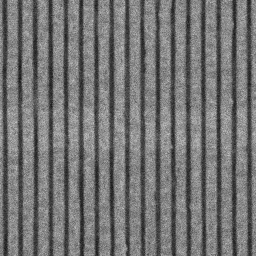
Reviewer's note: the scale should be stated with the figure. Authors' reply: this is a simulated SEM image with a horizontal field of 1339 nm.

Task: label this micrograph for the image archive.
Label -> parallel lines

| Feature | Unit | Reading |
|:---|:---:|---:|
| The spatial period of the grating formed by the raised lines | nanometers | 79.8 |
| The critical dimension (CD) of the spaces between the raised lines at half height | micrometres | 0.0229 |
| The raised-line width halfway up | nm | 58.8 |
